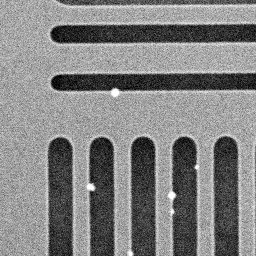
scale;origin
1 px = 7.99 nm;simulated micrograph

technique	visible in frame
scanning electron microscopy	groups of lines, slits or small figures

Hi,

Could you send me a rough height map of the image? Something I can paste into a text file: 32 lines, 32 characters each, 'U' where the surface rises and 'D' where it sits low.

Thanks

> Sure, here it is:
UUUUUUUUDDDDDDDDDDDDDDDDDDDDDDDD
UUUUUUUUUUUUUUUUUUUUUUUUUUUUUUUU
UUUUUUUUUUUUUUUUUUUUUUUUUUUUUUUU
UUUUUUUDDDDDDDDDDDDDDDDDDDDDDDDD
UUUUUUDDDDDDDDDDDDDDDDDDDDDDDDDD
UUUUUUUUUUUUUUUUUUUUUUUUUUUUUUUU
UUUUUUUUUUUUUUUUUUUUUUUUUUUUUUUU
UUUUUUUUUUUUUUUUUUUUUUUUUUUUUUUU
UUUUUUUUUUUUUUUUUUUUUUUUUUUUUUUU
UUUUUUUDDDDDDDDDDDDDDDDDDDDDDDDD
UUUUUUDDDDDDDDDDDDDDDDDDDDDDDDDD
UUUUUUUUDDDDDDUUUUUUUUUUUUUUUUUU
UUUUUUUUUUUUUUUUUUUUUUUUUUUUUUUU
UUUUUUUUUUUUUUUUUUUUUUUUUUUUUUUU
UUUUUUUUUUUUUUUUUUUUUUUUUUUUUUUU
UUUUUUUUUUUUUUUUUUUUUUUUUUUUUUUU
UUUUUUUUUUUUUUUUUUUUUUUUUUUUUUUU
UUUUUUDDDUUUDDUUUDDUUUDDUUUDDUUU
UUUUUUDDDUUDDDUUDDDUUUDDDUUDDDUU
UUUUUUDDDUUDDDUUDDDUUDDDDUUDDDUU
UUUUUUDDDUUDDDUUDDDUUDDDDUUDDDUU
UUUUUUDDDUUDDDUUDDDUUDDDDUUDDDUU
UUUUUUDDDUUDDDUUDDDUUDDDDUUDDDUU
UUUUUUDDDUUDDDUUDDDDUDDDDUUDDDUU
UUUUUUDDDUUDDDUUDDDDUUDDDUUDDDUU
UUUUUUDDDUUDDDUUDDDDUUDDDUUDDDUU
UUUUUUDDDUUDDDUUDDDDUUDDDUUDDDUU
UUUUUUDDDUUDDDUUDDDDUUDDDUUDDDUU
UUUUUUDDDUUDDDUUDDDDUUDDDUUDDDUU
UUUUUUDDDUUDDDUUDDDDUUDDDUUDDDUU
UUUUUUDDDUUDDDUUDDDDUUDDDUUDDDUU
UUUUUUDDDUUDDDUUDDDDUUDDDUUDDDUU